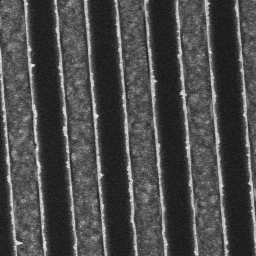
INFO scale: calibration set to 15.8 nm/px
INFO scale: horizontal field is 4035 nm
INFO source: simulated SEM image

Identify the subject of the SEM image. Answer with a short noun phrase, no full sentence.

parallel lines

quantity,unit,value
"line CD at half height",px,32.3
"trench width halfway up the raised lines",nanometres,438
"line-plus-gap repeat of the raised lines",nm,947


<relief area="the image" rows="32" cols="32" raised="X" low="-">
---XXXX----XXXX---XXXX----XXXX--
---XXXX----XXXX---XXXX----XXXX--
---XXXX----XXXX---XXXX----XXXX--
---XXXX----XXXX---XXXX----XXXX--
---XXXX----XXXX---XXXX----XXXX--
----XXX----XXXX---XXXXX---XXXX--
---XXXXX---XXXX----XXXX---XXXX--
----XXXX---XXXX----XXXX---XXXX--
----XXXX---XXXX----XXXX---XXXX--
----XXXX---XXXX----XXXX---XXXX--
----XXXX---XXXX----XXXX---XXXX--
----XXXX----XXXX---XXXX----XXXX-
X---XXXX----XXXX---XXXX----XXXX-
X---XXXX----XXXX---XXXX----XXXX-
X---XXXX----XXXX---XXXX----XXXX-
X---XXXX----XXXX---XXXX----XXXX-
X---XXXX----XXXX---XXXX----XXXX-
X---XXXX----XXXX----XXXX---XXXX-
X----XXXX---XXXX----XXXX---XXXX-
X----XXXX---XXXX----XXXX---XXXX-
X----XXXX---XXXX----XXXX---XXXX-
X----XXXX---XXXX----XXXX---XXXX-
X----XXXX---XXXX----XXXX---XXXX-
X----XXXX---XXXX----XXXX----XXXX
X----XXXX---XXXXX---XXXX----XXXX
XX---XXXX----XXXX---XXXX----XXXX
XX---XXXX----XXXX---XXXX----XXXX
XX---XXXX----XXXX---XXXX----XXXX
XX---XXXX----XXXX---XXXX----XXXX
XX---XXXX----XXXX---XXXX----XXXX
XX---XXXXX---XXXX----XXXX---XXXX
XX----XXXX---XXXX----XXXX---XXXX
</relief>